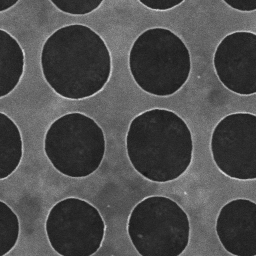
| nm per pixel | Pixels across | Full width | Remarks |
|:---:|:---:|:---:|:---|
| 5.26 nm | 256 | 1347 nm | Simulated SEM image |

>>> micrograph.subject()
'holes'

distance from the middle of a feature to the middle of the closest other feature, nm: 437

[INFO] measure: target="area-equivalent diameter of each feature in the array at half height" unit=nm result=350